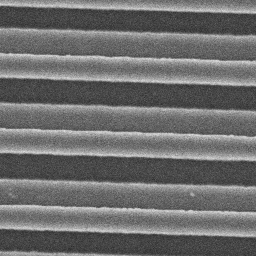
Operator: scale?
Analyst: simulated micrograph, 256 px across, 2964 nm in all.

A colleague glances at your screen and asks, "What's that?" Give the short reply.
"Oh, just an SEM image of lines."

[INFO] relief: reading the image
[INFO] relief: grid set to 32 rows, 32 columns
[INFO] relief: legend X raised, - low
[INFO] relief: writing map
XXXXXXXXXXXXXXXXXXXXXXXXXXXXXXXX
----------------------------XXXX
--------------------------------
--------------------------------
XXXXXXXXXXXXXXXXXXXXXXXXXXXX----
XXXXXXXXXXXXXXXXXXXXXXXXXXXXXXXX
XXXXXXXXXXXXXXXXXXXXXXXXXXXXXXXX
XXXXXXXXXXXXXXXXXXXXXXXXXXXXXXXX
XXXXXXXXXXXXXXXXXXXXXXXXXXXXXXXX
XXXXXXXXXXXXXXXXXXXXXXXXXXXXXXXX
---------------------------XXXXX
--------------------------------
--------------------------------
XXXXXXXXXXXXXXXXX---------------
XXXXXXXXXXXXXXXXXXXXXXXXXXXXXXXX
XXXXXXXXXXXXXXXXXXXXXXXXXXXXXXXX
XXXXXXXXXXXXXXXXXXXXXXXXXXXXXXXX
XXXXXXXXXXXXXXXXXXXXXXXXXXXXXXXX
XXXXXXXXXXXXXXXXXXXXXXXXXXXXXXXX
---------------XXXXXXXXXXXXXXXXX
--------------------------------
--------------------------------
--------------------------------
XXXXXXXXXXXXXXXXXXXXXXXXXXXXXX--
XXXXXXXXXXXXXXXXXXXXXXXXXXXXXXXX
XXXXXXXXXXXXXXXXXXXXXXXXXXXXXXXX
XXXXXXXXXXXXXXXXXXXXXXXXXXXXXXXX
XXXXXXXXXXXXXXXXXXXXXXXXXXXXXXXX
XXXXXXXXXXXXXXXXXXXXXXXXXXXXXXXX
--------------------------------
--------------------------------
--------------------------------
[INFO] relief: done